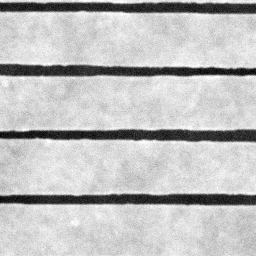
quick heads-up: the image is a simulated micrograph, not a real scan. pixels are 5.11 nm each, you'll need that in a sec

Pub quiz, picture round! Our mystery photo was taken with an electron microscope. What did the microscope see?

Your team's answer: lines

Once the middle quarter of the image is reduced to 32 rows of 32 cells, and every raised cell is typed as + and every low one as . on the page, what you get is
..........+++.++++++++++++++++++
................................
................................
++++++++++++++++++++++++++++++++
++++++++++++++++++++++++++++++++
++++++++++++++++++++++++++++++++
++++++++++++++++++++++++++++++++
++++++++++++++++++++++++++++++++
++++++++++++++++++++++++++++++++
++++++++++++++++++++++++++++++++
++++++++++++++++++++++++++++++++
++++++++++++++++++++++++++++++++
++++++++++++++++++++++++++++++++
++++++++++++++++++++++++++++++++
++++++++++++++++++++++++++++++++
++++++++++++++++++++++++++++++++
................................
................................
................................
+++++++++++++++++++++++++++++++.
++++++++++++++++++++++++++++++++
++++++++++++++++++++++++++++++++
++++++++++++++++++++++++++++++++
++++++++++++++++++++++++++++++++
++++++++++++++++++++++++++++++++
++++++++++++++++++++++++++++++++
++++++++++++++++++++++++++++++++
++++++++++++++++++++++++++++++++
++++++++++++++++++++++++++++++++
++++++++++++++++++++++++++++++++
++++++++++++++++++++++++++++++++
++++++++++++++++++++++++++++++++